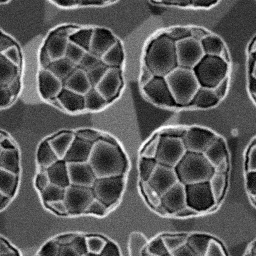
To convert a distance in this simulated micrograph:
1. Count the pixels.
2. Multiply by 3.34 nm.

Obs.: holes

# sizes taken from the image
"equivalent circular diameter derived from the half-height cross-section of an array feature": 286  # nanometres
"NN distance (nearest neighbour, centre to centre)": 0.347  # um